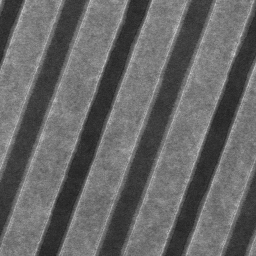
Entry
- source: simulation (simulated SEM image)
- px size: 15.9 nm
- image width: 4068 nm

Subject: lines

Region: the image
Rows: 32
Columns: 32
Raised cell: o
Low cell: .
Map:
...ooooo...ooooo...oooo....ooooo
...oooo....ooooo..ooooo...ooooo.
..ooooo...ooooo...ooooo...ooooo.
..ooooo...ooooo...oooo....ooooo.
.ooooo....oooo...ooooo...ooooo..
.ooooo...ooooo...ooooo...ooooo..
.oooo....ooooo...oooo....ooooo..
ooooo...ooooo...ooooo...ooooo...
ooooo...ooooo...oooo....ooooo...
oooo....ooooo..ooooo...ooooo...o
oooo...ooooo...ooooo...ooooo...o
oooo...ooooo...oooo....ooooo...o
ooo....ooooo..ooooo...ooooo...oo
ooo...ooooo...ooooo...ooooo...oo
ooo...ooooo...oooo....ooooo..ooo
oo....oooo...ooooo...ooooo...ooo
oo...ooooo...ooooo...ooooo...ooo
o....ooooo...oooo....ooooo..oooo
o...ooooo...ooooo...ooooo...oooo
o...ooooo...oooo....ooooo...oooo
....ooooo..ooooo....oooo...ooooo
...ooooo...ooooo...ooooo...oooo.
...ooooo...oooo....ooooo...oooo.
...ooooo..ooooo...ooooo...ooooo.
..ooooo...ooooo...ooooo...oooo..
..ooooo...oooo....ooooo..ooooo..
..oooo...ooooo...ooooo...ooooo..
.ooooo...oooo....ooooo...oooo...
.ooooo...oooo....ooooo..ooooo...
ooooo...ooooo...ooooo...ooooo...
ooooo...oooo....ooooo...oooo....
ooooo..ooooo....oooo...ooooo...o